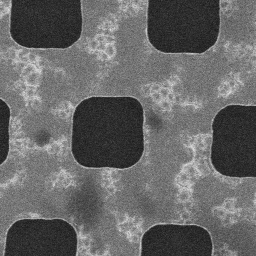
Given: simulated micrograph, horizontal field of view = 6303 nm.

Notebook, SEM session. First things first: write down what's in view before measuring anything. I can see holes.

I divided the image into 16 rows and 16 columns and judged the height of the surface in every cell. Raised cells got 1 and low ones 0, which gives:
1000011110000011
1000011110000011
1000011110000011
1111111111111111
1111111111111111
1111111111111111
1111100001111111
0111100001111000
0111000001111000
0111100001111000
1111111011111000
1111111111111111
1111111111111111
1111111111111111
1000011110000111
0000011110000111